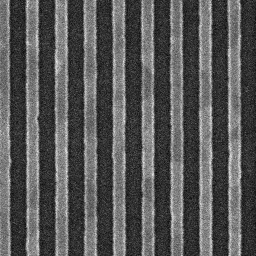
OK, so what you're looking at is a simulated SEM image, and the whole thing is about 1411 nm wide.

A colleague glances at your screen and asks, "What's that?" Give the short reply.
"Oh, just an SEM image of parallel lines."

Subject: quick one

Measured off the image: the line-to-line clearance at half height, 101 nm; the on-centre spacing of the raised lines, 159 nm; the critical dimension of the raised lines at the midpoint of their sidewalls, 11 pixels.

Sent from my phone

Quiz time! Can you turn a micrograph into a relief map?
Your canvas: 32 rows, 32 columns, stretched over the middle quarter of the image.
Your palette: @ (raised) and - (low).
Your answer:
@----@@@-----@@-----@@-----@@@--
@----@@@-----@@-----@@-----@@@--
@----@@@-----@@-----@@-----@@---
@----@@@-----@@-----@@-----@@@--
@----@@@-----@@-----@@-----@@@--
@----@@@-----@@-----@@-----@@@--
@----@@@-----@@-----@@-----@@@--
@----@@@-----@@-----@@-----@@---
@----@@@-----@@-----@@-----@@---
@----@@@-----@@-----@@-----@@---
@----@@@-----@@-----@@-----@@---
@----@@@----@@@-----@@-----@@---
@----@@@-----@@-----@@-----@@---
@----@@@-----@@-----@@-----@@---
@----@@@-----@@-----@@-----@@---
@----@@@-----@@-----@@-----@@---
@----@@@-----@@-----@@-----@@---
@----@@@-----@@-----@@-----@@@--
@----@@@-----@@-----@@-----@@@--
@----@@@----@@@-----@@-----@@@--
@----@@@----@@@-----@@-----@@@--
@----@@@----@@@-----@@-----@@@--
@----@@@----@@@-----@@-----@@@--
@----@@@----@@@-----@@-----@@@--
@----@@@-----@@-----@@-----@@@--
@----@@@-----@@-----@@-----@@@--
@----@@@-----@@-----@@-----@@@--
@----@@@-----@@-----@@-----@@@--
@----@@@-----@@-----@@-----@@@--
@----@@@-----@@-----@@-----@@---
@----@@@-----@@-----@@-----@@---
@----@@@----@@@-----@@-----@@---